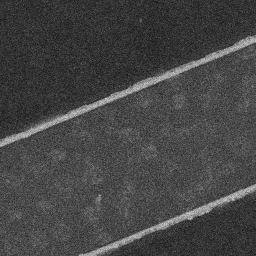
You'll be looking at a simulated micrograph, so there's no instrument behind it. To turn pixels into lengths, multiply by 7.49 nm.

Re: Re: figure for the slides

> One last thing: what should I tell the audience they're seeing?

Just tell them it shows one or a few lines or trenches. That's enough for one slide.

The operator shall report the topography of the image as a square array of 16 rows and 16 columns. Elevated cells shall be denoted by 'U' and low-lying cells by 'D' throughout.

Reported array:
UUUUUUUUUUUUUUUU
UUUUUUUUUUUUUUUU
UUUUUUUUUUUUUUUU
UUUUUUUUUUUUUDDD
UUUUUUUUUUUDDDDD
UUUUUUUUUDDDDDDD
UUUUUUDDDDDDDDDD
UUUUDDDDDDDDDDDD
UDDDDDDDDDDDDDDD
DDDDDDDDDDDDDDDD
DDDDDDDDDDDDDDDD
DDDDDDDDDDDDDDDD
DDDDDDDDDDDDDDUU
DDDDDDDDDDDUUUUU
DDDDDDDDDUUUUUUU
DDDDDDDUUUUUUUUU